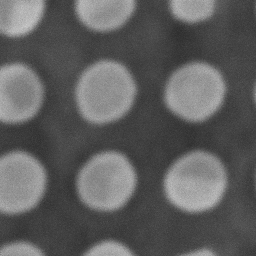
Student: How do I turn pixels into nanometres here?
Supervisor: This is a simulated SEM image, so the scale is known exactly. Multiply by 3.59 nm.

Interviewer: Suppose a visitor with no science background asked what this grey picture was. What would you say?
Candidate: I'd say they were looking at raised bodies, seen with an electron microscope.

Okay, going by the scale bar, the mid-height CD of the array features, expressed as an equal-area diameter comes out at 205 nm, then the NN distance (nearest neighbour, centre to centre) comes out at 321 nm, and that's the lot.